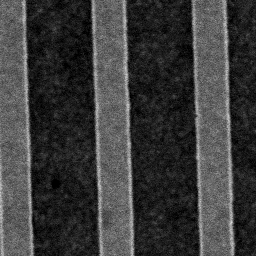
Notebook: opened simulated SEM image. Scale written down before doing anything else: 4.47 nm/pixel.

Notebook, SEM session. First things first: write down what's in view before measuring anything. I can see one or a few lines or trenches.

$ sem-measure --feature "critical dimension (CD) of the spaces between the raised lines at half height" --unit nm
306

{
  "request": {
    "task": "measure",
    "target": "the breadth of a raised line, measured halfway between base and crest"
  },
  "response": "141 nm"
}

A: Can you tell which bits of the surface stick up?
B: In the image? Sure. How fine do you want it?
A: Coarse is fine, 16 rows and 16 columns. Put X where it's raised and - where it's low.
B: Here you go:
XX----XX----XX--
XX----XX----XX--
XX----XX----XX--
XX----XX----XX--
XX----XX----XX--
XX----XX----XX--
XX----XX----XX--
XX----XX----XX--
XX----XX----XX--
XX----XX----XX--
XX----XX----XX--
XX----XX----XX--
XX----XX----XX--
XX----XX----XX--
XX----XX-----XX-
XX----XX-----XX-